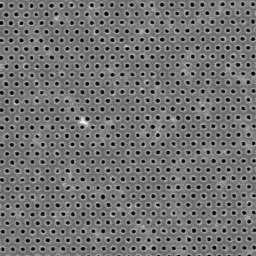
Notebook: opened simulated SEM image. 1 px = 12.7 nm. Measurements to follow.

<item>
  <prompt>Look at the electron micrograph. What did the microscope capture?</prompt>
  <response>a regular array of holes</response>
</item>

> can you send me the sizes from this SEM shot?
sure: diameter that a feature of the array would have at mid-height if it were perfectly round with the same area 51.8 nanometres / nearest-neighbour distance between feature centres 0.12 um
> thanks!